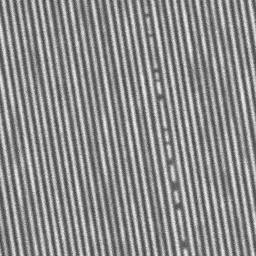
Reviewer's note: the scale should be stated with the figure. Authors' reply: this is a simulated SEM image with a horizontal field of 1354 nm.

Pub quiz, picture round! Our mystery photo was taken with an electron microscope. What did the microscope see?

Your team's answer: parallel lines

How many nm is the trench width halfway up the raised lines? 28.7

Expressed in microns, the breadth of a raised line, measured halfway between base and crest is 0.0098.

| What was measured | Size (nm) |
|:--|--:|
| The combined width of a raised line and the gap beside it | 38.9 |